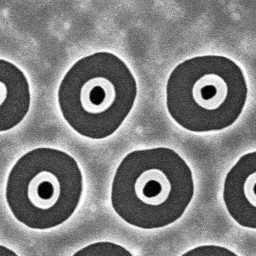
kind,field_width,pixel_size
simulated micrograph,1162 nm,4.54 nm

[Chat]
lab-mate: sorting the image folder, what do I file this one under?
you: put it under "ring-shaped grooves with a dot in the middle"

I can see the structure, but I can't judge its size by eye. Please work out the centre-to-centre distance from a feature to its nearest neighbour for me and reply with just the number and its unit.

486 nanometres